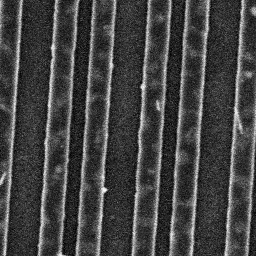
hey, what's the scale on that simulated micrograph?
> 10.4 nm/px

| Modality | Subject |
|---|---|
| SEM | parallel lines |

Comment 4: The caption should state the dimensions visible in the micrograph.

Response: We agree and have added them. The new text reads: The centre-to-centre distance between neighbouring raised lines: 468 nanometres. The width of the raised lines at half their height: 234 nm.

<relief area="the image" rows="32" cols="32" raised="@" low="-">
@@@----@@@--@@-----@@--@@@----@@
@@@----@@@--@@----@@@--@@@----@@
@@@----@@@--@@----@@@--@@@----@@
@@@----@@@-@@@----@@@--@@@----@@
@@@----@@--@@@----@@@--@@@----@@
@@-----@@--@@@----@@@--@@@----@@
@@-----@@--@@@----@@@--@@@----@@
@@----@@@--@@@----@@@--@@@----@@
@@----@@@--@@@----@@@--@@@----@@
@@----@@@--@@@----@@@--@@-----@@
@@----@@@--@@@----@@@--@@-----@@
@@----@@@--@@@----@@@--@@-----@@
@@----@@@--@@@----@@@--@@----@@@
@@----@@@--@@@----@@--@@@----@@@
@@----@@@--@@-----@@--@@@----@@@
@@----@@@--@@-----@@--@@@----@@@
@@----@@@--@@----@@@--@@@----@@@
@@----@@@--@@----@@@--@@@----@@@
@@----@@--@@@----@@@--@@@----@@@
@-----@@---@@----@@@--@@@----@@@
@-----@@--@@@----@@@--@@@----@@@
@-----@@--@@@----@@@--@@@----@@@
@-----@@--@@@----@@@--@@@----@@@
@----@@@--@@@----@@@--@@@----@@-
@----@@@--@@@----@@@--@@-----@@-
@----@@@--@@@----@@@--@@-----@@-
@----@@@--@@@----@@@--@@-----@@-
@----@@@--@@@----@@@-@@@----@@@-
@----@@@--@@@----@@--@@@----@@@-
@----@@@--@@-----@@--@@@----@@@-
@----@@@--@@-----@@--@@@----@@@-
@----@@@--@@-----@@--@@@----@@@-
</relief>